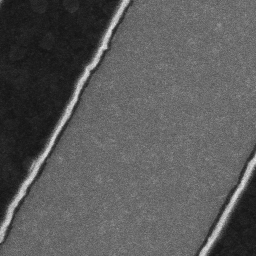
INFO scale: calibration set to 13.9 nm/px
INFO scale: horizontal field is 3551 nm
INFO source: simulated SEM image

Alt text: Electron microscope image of one or a few lines or trenches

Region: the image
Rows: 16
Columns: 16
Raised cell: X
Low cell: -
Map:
XXXXXXXX--------
XXXXXXX---------
XXXXXXX---------
XXXXXX----------
XXXXXX----------
XXXXX-----------
XXXXX-----------
XXXX------------
XXX-------------
XXX-------------
XX--------------
XX-------------X
X--------------X
X-------------XX
-------------XXX
-------------XXX